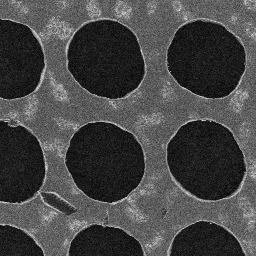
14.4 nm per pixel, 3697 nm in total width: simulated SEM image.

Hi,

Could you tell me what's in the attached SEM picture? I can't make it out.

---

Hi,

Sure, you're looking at holes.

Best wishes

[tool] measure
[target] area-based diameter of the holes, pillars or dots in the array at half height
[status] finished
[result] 1130 nanometres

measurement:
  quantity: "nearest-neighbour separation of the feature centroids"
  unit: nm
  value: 1450